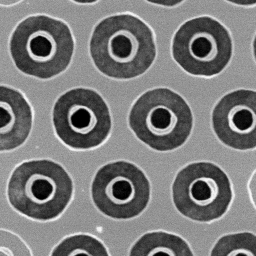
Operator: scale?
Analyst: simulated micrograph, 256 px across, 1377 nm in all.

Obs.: a regular array of ring-shaped grooves with a dot in the middle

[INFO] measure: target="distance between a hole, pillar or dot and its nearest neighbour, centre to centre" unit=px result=79.9